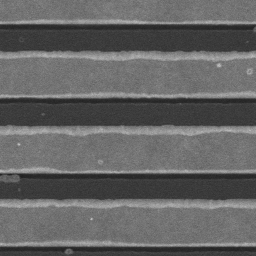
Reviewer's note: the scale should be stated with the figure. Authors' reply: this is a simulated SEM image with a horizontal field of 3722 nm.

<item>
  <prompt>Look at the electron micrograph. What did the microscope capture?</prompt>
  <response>lines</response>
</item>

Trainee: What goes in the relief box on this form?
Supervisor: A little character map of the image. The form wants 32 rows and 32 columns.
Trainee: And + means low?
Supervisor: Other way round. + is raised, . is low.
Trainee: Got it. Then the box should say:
++++++++++++++++++++++++++++++++
++++++++++++++++++++++++++++++++
++++++++++++++++++++++++++++++++
................................
................................
................................
................................
++++++++++++++++++++++++++++++++
++++++++++++++++++++++++++++++++
++++++++++++++++++++++++++++++++
++++++++++++++++++++++++++++++++
++++++++++++++++++++++++++++++++
................................
................................
................................
................................
++++++++++++++++++++++++++++++++
++++++++++++++++++++++++++++++++
++++++++++++++++++++++++++++++++
++++++++++++++++++++++++++++++++
++++++++++++++++++++++++++++++++
++++++++++++++++++++++++++++++++
................................
................................
................................
++++++++++++++++++++++++++++++++
++++++++++++++++++++++++++++++++
++++++++++++++++++++++++++++++++
++++++++++++++++++++++++++++++++
++++++++++++++++++++++++++++++++
++++++++++++++++++++++++++++++++
................................